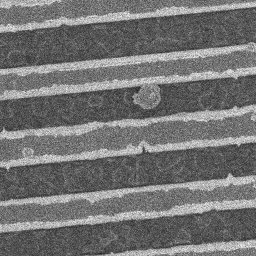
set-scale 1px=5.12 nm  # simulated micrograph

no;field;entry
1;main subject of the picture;one or a few lines or trenches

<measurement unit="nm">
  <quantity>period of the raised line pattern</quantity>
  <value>337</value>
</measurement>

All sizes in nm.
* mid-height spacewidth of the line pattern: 198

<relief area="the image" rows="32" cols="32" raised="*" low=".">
********************************
**********************..........
************....................
****............................
................................
...............................*
..........................******
................****************
......**************************
***************************.....
*****************...............
*******...........*.............
..................*.............
................................
........................********
..............******************
...*****************************
*******************************.
*********************...........
************....................
**..............................
................................
............................****
....................************
..........**********************
********************************
**********************..........
*************...................
**..............................
................................
..............................**
....................************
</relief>